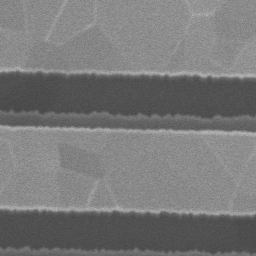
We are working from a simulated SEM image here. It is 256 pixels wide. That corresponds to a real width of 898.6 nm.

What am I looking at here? lines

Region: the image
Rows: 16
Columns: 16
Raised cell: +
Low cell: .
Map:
++++++++++++++++
++++++++++++++++
++++++++++++++++
++++++++++++++++
..++++++++++++++
................
................
++++++++++++++++
++++++++++++++++
++++++++++++++++
++++++++++++++++
++++++++++++++++
++++++++++++++++
................
................
................